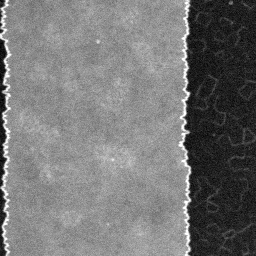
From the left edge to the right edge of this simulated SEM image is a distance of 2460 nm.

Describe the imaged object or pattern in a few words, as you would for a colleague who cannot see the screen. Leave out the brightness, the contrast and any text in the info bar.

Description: one or a few lines or trenches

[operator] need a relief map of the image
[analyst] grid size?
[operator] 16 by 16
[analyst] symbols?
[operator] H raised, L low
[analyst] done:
LLLLLLLLLLLLHHHH
LLLLLLLLLLLLHHHH
LLLLLLLLLLLLHHHH
LLLLLLLLLLLLHHHH
LLLLLLLLLLLLHHHH
LLLLLLLLLLLLHHHH
LLLLLLLLLLLLHHHH
LLLLLLLLLLLHHHHH
LLLLLLLLLLLHHHHH
LLLLLLLLLLLLHHHH
LLLLLLLLLLLLHHHH
LLLLLLLLLLLLHHHH
LLLLLLLLLLLLHHHH
LLLLLLLLLLLLHHHH
LLLLLLLLLLLLHHHH
LLLLLLLLLLLLHHHH